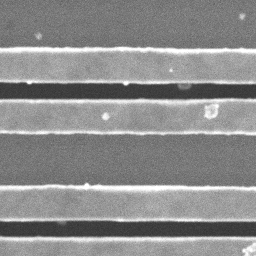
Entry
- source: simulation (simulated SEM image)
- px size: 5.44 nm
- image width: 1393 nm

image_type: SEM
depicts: lines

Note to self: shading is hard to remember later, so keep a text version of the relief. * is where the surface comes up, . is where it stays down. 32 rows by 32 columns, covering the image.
................................
................................
................................
................................
................................
................................
********************************
********************************
********************************
********************************
...............*................
................................
********************************
********************************
********************************
********************************
********************************
................................
................................
................................
................................
................................
................................
********************************
********************************
********************************
********************************
********......******************
................................
................................
********************************
********************************